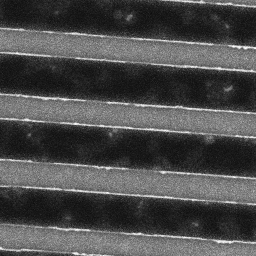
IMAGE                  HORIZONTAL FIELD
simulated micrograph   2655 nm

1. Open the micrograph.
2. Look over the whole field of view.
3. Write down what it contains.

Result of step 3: one or a few lines or trenches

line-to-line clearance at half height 22.8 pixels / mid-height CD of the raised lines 436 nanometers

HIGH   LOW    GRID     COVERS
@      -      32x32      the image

@@@@@@@@@@@@@@@@@@@@@@@@@@@@@---
@@@@@@@@@@@@@@@@@@@@@@@@@@@@@@@@
@@@@@@@@@@@@@@@@@@@@@@@@@@@@@@@@
@@@@@@@@@@@@@@@@@@@@@@@@@@@@@@@@
------------@@@@@@@@@@@@@@@@@@@@
-------------------------@@@@@@@
--------------------------------
@@@@@@@@@@@@@-------------------
@@@@@@-@@@@@@@@@@@@@@@@@@@@@----
@@@@@@@@@@@@@@@@@@@@@@@@@@@@@@@@
@@@@@@@@@@@@@@@@@@@@@@@@@@@@@@@@
@@@@@@@@@@@@@@@@@@@@@@@@@@@@-@@@
--------@@@@@@@@@@@@@@@@@@@@@@@@
-----------------------@@@@@@@@@
--------------------------------
@@@@@@@@@@----------------------
@@@@@@@@@@@@@@@@@@@@@@----------
@@@@@@@@@@@@@@@@@@@@@@@@@@@@@@@@
@@@@@@@@@@@@@@@@@@@@@@@@@@@@@@@@
@@@@@@@@@@@@@@@@@@@@@@@@@@@@@@@@
--------@@@@@@@@@@@@@@@@@@@@@@@@
--------------------@@@@@@@@@@@@
--------------------------------
@@@@@@@-------------------------
@@@@@@@@@@@@@@@@@@@-------------
@@@@@@@@@@@@@@@@@-@@@@@@@@@@@@@-
@@@@@@@@@@@@@@@@@@@@@@@@@@@@@@@@
@@@@@@@@@@@@@@@@@@@@@@@@@@@@@@@@
------@@@@@@@@@@@@@@@@@@@@@@@@@@
--------------------@@@@@@@@@@@@
--------------------------------
@@@@@@@-------------------------